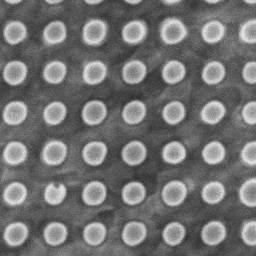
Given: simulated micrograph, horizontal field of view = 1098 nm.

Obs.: a regular array of raised bodies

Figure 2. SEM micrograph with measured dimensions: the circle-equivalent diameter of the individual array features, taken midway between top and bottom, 92.4 nm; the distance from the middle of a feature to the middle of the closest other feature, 39.5 pixels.